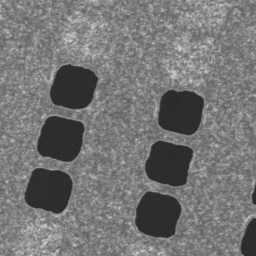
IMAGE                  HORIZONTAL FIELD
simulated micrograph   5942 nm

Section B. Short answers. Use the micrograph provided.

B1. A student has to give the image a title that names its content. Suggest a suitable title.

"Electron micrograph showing holes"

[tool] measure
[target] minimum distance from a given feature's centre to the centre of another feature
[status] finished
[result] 1.23 um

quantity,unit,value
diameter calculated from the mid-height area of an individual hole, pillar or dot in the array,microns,1.08